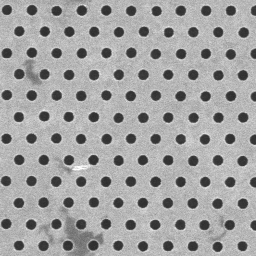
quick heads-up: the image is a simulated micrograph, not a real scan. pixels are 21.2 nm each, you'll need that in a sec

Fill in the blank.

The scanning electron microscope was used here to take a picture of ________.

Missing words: a regular array of holes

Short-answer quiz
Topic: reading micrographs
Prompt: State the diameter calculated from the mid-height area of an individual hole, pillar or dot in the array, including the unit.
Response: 10.6 px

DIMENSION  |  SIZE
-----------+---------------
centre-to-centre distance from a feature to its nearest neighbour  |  24.4 px